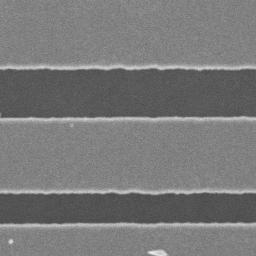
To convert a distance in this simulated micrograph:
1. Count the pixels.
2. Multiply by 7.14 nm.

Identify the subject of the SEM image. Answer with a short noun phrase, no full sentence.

lines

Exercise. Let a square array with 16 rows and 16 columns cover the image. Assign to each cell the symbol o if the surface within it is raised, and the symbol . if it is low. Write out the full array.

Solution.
oooooooooooooooo
oooooooooooooooo
oooooooooooooooo
oooooooooooooooo
................
................
................
oooooooooooooooo
oooooooooooooooo
oooooooooooooooo
oooooooooooooooo
oooooooooooooooo
................
................
oooooooooooooooo
oooooooooooooooo